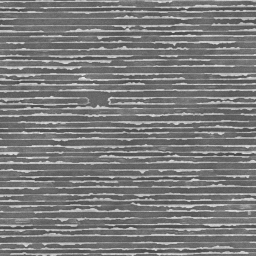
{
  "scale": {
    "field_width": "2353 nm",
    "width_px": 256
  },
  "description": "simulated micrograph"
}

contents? parallel lines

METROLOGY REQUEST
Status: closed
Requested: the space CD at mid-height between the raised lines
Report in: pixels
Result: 4.5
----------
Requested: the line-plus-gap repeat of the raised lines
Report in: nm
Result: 112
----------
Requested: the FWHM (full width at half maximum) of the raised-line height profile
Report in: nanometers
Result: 67.8